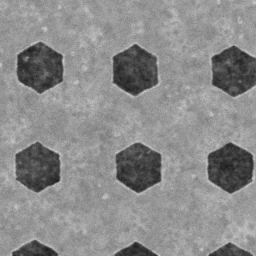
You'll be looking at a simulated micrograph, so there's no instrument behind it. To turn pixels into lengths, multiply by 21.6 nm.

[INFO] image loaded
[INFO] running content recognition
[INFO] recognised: holes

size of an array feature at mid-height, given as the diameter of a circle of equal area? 48.4 pixels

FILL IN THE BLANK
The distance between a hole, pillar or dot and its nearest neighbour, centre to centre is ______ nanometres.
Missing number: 2060